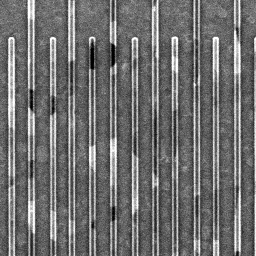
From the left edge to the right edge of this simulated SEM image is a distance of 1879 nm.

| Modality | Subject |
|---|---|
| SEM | parallel lines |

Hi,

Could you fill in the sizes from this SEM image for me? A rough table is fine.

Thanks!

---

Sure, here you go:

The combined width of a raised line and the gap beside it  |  20.5 px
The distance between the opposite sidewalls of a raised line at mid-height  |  37.6 nanometers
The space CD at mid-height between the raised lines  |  15.4 pixels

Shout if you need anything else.